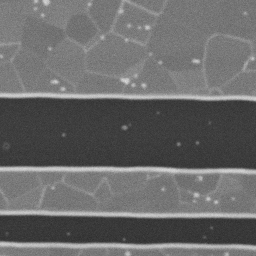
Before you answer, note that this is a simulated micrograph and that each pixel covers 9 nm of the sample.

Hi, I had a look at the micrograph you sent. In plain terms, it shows wiring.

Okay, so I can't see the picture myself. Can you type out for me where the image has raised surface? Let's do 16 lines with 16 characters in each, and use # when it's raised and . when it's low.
################
################
################
################
################
################
................
................
................
................
................
################
################
................
................
################